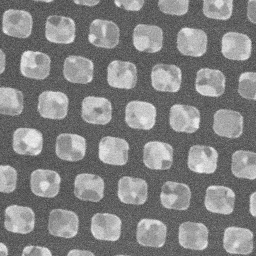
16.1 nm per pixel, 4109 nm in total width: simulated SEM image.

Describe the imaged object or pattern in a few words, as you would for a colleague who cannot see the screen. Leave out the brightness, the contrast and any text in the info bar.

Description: a regular array of raised bodies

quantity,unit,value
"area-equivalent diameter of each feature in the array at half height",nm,464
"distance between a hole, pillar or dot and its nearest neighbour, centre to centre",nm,699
